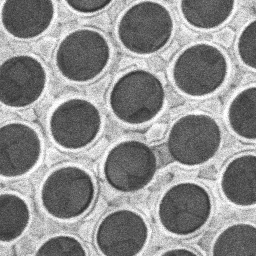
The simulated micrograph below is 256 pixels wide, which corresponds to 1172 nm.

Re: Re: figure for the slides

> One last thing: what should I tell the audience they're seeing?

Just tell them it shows holes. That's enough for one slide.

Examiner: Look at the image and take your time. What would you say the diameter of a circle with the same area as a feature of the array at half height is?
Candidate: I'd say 236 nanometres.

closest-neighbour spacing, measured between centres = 315 nanometers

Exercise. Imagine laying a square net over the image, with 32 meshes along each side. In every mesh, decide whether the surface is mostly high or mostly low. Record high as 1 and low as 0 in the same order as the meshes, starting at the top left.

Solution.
10000001100001111000111000000111
00000001110011110000011000000111
00000011111111100000011000001111
10000011111111100000001110111110
11001111000001100000011111111100
11111111000001100000011111111100
11111110000000111001111000011100
10001110000001111111110000001100
00000110000001111111110000001111
00000011000011100001110000001111
00000011111111000000110000001111
00000111111111000000111000111100
00001111101111000000111111111000
11111110000011000000111111111000
11111110000011100001111000111000
10111100000001111111110000011000
00001100000011111111100000011000
00000110000111111111100000001111
00000111101111000000100000011111
00000111111110000000100000011100
00001111111110000000011001111000
00011110000110000000111111110000
11111100000110000001111111110000
11111000000011000011100001110000
00111000000011111111000000110000
00011000000111111111000000111100
00001100001111000111000000111111
00001111111110000011000000111111
00011111111100000011100001111000
00111111111100000011111111100000
11111000001100000011111111100000
11111000000110000111100011100000